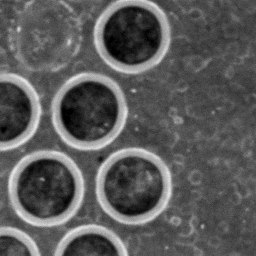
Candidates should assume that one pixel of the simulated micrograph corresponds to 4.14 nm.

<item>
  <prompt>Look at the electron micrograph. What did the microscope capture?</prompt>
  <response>holes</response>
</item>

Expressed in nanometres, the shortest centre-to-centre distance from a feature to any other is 361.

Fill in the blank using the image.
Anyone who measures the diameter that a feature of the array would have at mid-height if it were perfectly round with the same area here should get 272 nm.